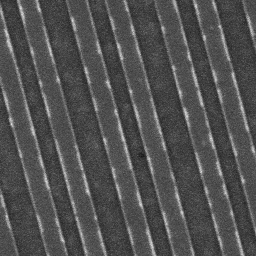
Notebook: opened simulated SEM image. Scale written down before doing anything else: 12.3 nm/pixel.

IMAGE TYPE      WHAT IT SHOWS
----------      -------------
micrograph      parallel lines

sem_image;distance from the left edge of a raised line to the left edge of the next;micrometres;0.52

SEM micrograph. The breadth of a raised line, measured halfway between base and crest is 244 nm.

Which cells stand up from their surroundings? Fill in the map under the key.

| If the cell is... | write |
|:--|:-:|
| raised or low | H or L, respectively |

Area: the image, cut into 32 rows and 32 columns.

LLHHHLLLHHHLLHHHLLLHHHLLHHHLLLHH
LLLHHLLLLHHLLLHHLLLLHHLLLHHLLLLH
LLLHHLLLLHHLLLHHLLLLHHLLLHHLLLLH
HLLHHHLLLHHHLLHHHLLLHHHLLHHHLLLH
HLLHHHLLLHHHLLHHHLLLHHHLLHHHLLLH
HLLLHHLLLLHHLLLHHLLLLHHLLLHHLLLL
HHLLHHLLLLHHHLLHHLLLLHHHLLHHLLLL
HHLLHHHLLLHHHLLHHHLLLHHHLLHHHLLL
HHLLHHHLLLLHHLLHHHLLLLHHLLHHHLLL
HHLLLHHLLLLHHLLLHHLLLLHHLLLHHLLL
HHHLLHHHLLLHHHLLHHHLLLHHHLLHHHLL
HHHLLHHHLLLHHHLLHHHLLLHHHLLHHHLL
LHHLLLHHLLLLHHLLLHHLLLLHHLLLHHLL
LHHLLLHHLLLLHHLLLHHLLLLHHLLLHHLL
LHHHLLHHHLLLHHHLLHHHLLLHHHLLHHHL
LHHHLLHHHLLLHHHLLHHHLLLHHHLLHHHL
LLHHLLLHHLLLLHHLLLHHLLLLHHLLLHHL
LLHHLLLHHLLLLHHHLLHHLLLLHHHLLHHL
LLHHHLLHHHLLLHHHLLHHHLLLHHHLLHHH
LLLHHLLHHHLLLLHHLLHHHLLLLHHLLHHH
LLLHHLLLHHLLLLHHLLLHHLLLLHHLLLHH
LLLHHHLLHHLLLLHHHLLHHLLLLHHHLLHH
LLLHHHLLHHHLLLHHHLLHHHLLLHHHLLHH
LLLLHHLLHHHLLLLHHLLHHHLLLLHHLLHH
LLLLHHLLLHHLLLLHHLLLHHLLLLHHLLLH
HLLLHHHLLHHHLLLHHHLLHHHLLLHHHLLH
HLLLHHHLLHHHLLLHHHLLHHHLLLHHHLLH
HLLLLHHLLLHHLLLLHHLLLHHLLLLHHLLL
HLLLLHHLLLHHLLLLHHLLLHHLLLLHHLLL
HHLLLHHHLLHHHLLLHHHLLHHHLLLHHHLL
HHLLLLHHLLHHHLLLHHHLLHHHLLLHHHLL
HHLLLLHHLLLHHLLLLHHLLLHHLLLLHHLL